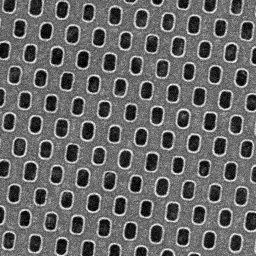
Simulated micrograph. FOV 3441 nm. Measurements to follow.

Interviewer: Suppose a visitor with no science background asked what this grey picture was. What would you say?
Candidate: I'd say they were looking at a regular array of holes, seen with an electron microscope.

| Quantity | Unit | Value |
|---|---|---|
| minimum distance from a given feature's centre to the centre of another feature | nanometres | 355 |